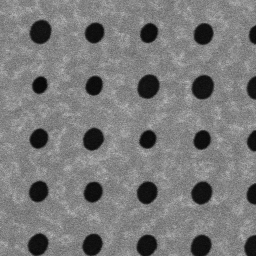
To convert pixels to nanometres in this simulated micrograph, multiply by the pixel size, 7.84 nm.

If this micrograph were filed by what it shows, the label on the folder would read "a regular array of holes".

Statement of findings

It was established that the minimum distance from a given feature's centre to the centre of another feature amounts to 415 nanometres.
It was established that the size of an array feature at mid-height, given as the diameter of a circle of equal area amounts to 158 nm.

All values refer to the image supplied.